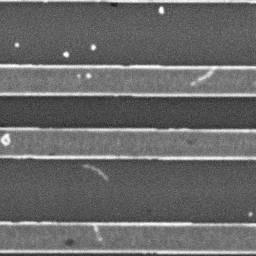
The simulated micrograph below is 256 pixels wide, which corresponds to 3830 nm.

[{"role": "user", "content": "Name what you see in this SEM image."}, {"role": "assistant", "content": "lines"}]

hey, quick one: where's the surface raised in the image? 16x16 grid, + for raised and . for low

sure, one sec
................
................
................
................
++++++++++++++++
++++++++++++++++
................
................
++++++++++++++++
++++++++++++++++
................
................
................
................
++++++++++++++++
++++++++++++++++